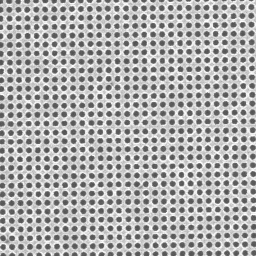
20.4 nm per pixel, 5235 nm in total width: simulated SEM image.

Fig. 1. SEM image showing a regular array of holes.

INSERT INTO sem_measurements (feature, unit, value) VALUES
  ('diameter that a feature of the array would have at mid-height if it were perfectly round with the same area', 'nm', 126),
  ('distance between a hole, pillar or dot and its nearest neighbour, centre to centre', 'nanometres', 175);